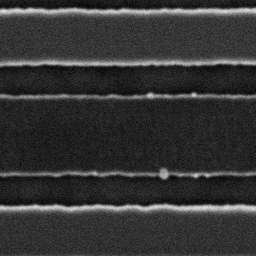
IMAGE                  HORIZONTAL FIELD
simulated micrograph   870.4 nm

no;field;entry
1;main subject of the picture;lines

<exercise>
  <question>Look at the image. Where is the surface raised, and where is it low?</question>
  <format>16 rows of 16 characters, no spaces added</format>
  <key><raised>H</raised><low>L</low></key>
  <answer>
LLLLLLLLLLLLLLLL
HHHHHHHHHHHHHHHH
HHHHHHHHHHHHHHHH
HHHHHHHHHHHHHHHH
LLLLLLLLLLLLLLLL
LLLLLLLLLLLLLLLL
HHHHHHHHHHHHHHHH
HHHHHHHHHHHHHHHH
HHHHHHHHHHHHHHHH
HHHHHHHHHHHHHHHH
HHHHHHHHHHHHHHHH
LLLLLLLLLLLLLLLL
LLLLLLLLLLLLLLLL
HHHHHHHHHHHHHHHH
HHHHHHHHHHHHHHHH
HHHHHHHHHHHHHHHH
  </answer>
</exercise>